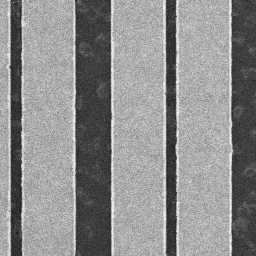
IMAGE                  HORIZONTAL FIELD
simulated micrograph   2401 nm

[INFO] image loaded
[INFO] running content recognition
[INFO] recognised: one or a few lines or trenches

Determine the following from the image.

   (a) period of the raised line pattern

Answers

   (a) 728 nanometers